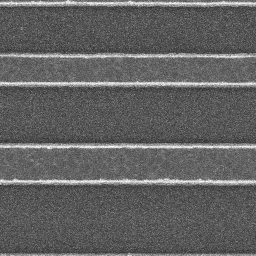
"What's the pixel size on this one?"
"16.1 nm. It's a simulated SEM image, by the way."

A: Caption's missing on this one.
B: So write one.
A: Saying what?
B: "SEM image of one or a few lines or trenches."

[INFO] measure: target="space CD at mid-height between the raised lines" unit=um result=0.936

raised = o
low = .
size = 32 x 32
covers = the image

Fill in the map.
................................
................................
................................
................................
................................
................................
................................
oooooooooooooooooooooooooooooooo
oooooooooooooooooooooooooooooooo
oooooooooooooooooooooooooooooooo
................................
................................
................................
................................
................................
................................
................................
................................
oooooooooooooooooooooooooooooooo
oooooooooooooooooooooooooooooooo
oooooooooooooooooooooooooooooooo
oooooooooooooooooooooooooooooooo
oooooooooooooooooooooooooooooooo
................................
................................
................................
................................
................................
................................
................................
................................
................................